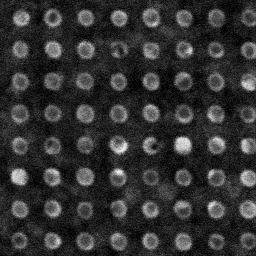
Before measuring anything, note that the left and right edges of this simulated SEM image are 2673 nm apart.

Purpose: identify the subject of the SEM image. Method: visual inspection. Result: a regular array of raised bodies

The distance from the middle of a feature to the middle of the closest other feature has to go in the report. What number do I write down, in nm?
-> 329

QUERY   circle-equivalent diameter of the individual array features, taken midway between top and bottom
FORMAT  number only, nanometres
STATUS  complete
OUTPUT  153